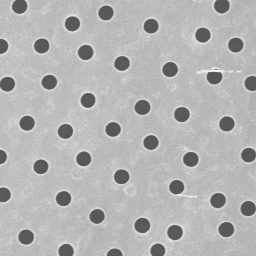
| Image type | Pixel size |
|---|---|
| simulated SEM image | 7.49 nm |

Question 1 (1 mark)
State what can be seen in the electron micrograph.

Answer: a regular array of holes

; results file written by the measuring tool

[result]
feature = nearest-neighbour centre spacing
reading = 276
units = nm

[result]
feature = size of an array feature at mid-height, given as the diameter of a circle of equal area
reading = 110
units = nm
